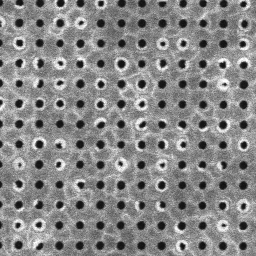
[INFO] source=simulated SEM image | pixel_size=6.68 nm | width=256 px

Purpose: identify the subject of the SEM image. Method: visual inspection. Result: a regular array of holes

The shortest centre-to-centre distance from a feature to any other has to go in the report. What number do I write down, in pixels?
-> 20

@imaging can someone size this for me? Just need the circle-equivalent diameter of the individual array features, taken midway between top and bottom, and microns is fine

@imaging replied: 0.0554